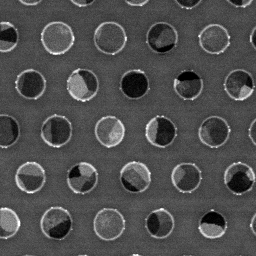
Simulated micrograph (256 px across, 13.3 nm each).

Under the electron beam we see a regular array of raised bodies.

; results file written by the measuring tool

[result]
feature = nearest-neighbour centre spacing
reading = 688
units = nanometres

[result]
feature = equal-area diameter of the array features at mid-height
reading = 385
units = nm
